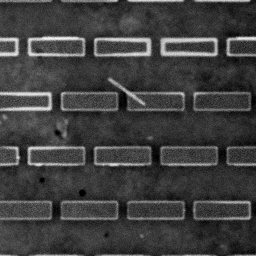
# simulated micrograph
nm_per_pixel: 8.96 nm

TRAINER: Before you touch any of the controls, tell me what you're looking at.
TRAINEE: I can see groups of lines, slits or small figures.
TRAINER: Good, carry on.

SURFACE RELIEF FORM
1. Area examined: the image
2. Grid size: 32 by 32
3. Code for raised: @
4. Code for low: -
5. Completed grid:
--------------------------------
--------------------------------
--------------------------------
--------------------------------
--------------------------------
@@--@@@@@@@-@@@@@@@-@@@@@@@-@@@@
@@--@@@@@@@-@@@@@@---@@@@@@-@@@@
--------------------------------
--------------------------------
--------------------------------
--------------------------------
--------------------------------
@@@@@@--@@@@@@@-@@@@@@@-@@@@@@@-
@@@@@@--@@@@@@@-@@@@@@@-@@@@@@@-
--------------------------------
--------------------------------
--------------------------------
--------------------------------
@@---@@@@@--@@@@@@@-@@@@@@@--@@@
@@--@@@@@@@-@@@@@@@-@@@@@@@-@@@@
@@--@@@@@@--@@@@@@@-@@@@@@@--@@@
--------------------------------
--------------------------------
--------------------------------
--------------------------------
@@@@@@--@@@@@@@-@@@@@@@-@@@@@@@-
@@@@@@--@@@@@@@-@@@@@@@-@@@@@@@-
--------------------------------
--------------------------------
--------------------------------
--------------------------------
--------------------------------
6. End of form